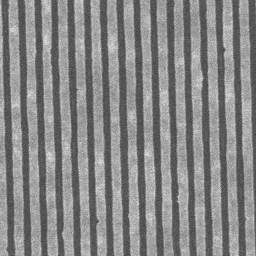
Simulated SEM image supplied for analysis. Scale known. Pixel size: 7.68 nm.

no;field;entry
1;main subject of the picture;parallel lines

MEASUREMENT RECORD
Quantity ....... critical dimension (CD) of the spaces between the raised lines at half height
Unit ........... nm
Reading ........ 57.6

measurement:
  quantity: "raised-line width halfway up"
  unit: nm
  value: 71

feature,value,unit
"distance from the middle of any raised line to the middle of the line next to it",16.5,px